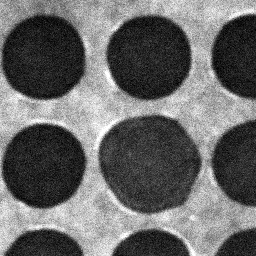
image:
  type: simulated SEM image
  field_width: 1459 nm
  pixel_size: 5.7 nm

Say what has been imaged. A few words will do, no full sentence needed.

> holes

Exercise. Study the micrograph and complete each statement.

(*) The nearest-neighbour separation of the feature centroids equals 601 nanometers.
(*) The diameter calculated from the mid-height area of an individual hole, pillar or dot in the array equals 0.494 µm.